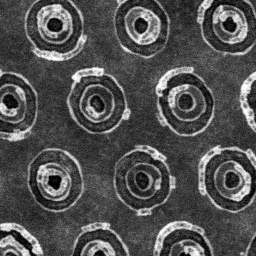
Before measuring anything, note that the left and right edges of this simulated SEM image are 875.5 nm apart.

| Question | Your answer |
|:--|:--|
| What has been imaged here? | ring-shaped grooves with a dot in the middle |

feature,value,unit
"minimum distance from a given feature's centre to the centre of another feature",292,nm